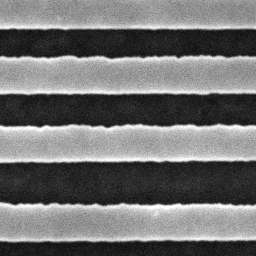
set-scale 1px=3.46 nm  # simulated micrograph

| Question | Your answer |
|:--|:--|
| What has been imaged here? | lines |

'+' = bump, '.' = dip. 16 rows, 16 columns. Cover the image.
++++++++++++++++
++++++++++++++++
................
................
++++++++++++++++
++++++++++++++++
................
................
++++++++++++++++
++++++++++++++++
................
................
................
++++++++++++++++
++++++++++++++++
................